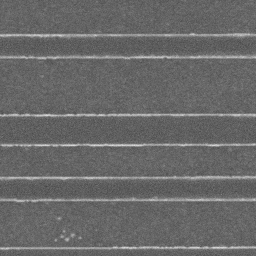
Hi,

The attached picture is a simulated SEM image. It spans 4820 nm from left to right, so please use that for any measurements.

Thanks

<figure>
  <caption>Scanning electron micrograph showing lines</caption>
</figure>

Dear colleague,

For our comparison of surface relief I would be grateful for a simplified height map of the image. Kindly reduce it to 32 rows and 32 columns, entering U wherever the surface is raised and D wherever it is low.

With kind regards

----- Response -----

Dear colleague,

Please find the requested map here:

DDDDDDDDDDDDDDDDDDDDDDDDDDDDDDDD
DDDDDDDDDDDDDDDDDDDDDDDDDDDDDDDD
DDDDDDDDDDDDDDDDDDDDDDDDDDDDDDDD
DDDDDDDDDDDDDDDDDDDDDDDDDDDDDDDD
UUUUUUUUUUUUUUUUUUUUUUUUUUUUUUUU
UUUUUUUUUUUUUUUUUUUUUUUUUUUUUUUU
UUUUUUUUUUUUUUUUUUUUUUUUUUUUUUUU
DDDDDDDDDDDDDDDDDDDDDDDDDDDDDDDD
DDDDDDDDDDDDDDDDDDDDDDDDDDDDDDDD
DDDDDDDDDDDDDDDDDDDDDDDDDDDDDDDD
DDDDDDDDDDDDDDDDDDDDDDDDDDDDDDDD
DDDDDDDDDDDDDDDDDDDDDDDDDDDDDDDD
DDDDDDDDDDDDDDDDDDDDDDDDDDDDDDDD
DDDDDDDDDDDDDDDDDDDDDDDDDDDDDDDD
UUUUUUUUUUUUUUUUUUUUUUUUUUUUUUUU
UUUUUUUUUUUUUUUUUUUUUUUUUUUUUUUU
UUUUUUUUUUUUUUUUUUUUUUUUUUUUUUUU
UUUUUUUUUUUUUUUUUUUUUUUUUUUUUUUU
DDDDDDDDDDDDDDDDDDDDDDDDDDDDDDDD
DDDDDDDDDDDDDDDDDDDDDDDDDDDDDDDD
DDDDDDDDDDDDDDDDDDDDDDDDDDDDDDDD
DDDDDDDDDDDDDDDDDDDDDDDDDDDDDDDD
UUUUUUUUUUUUUUUUUUUUUUUUUUUUUUUU
UUUUUUUUUUUUUUUUUUUUUUUUUUUUUUUU
UUUUUUUUUUUUUUUUUUUUUUUUUUUUUUUU
DDDDDDDDDDDDDDDDDDDDDDDDDDDDDDDD
DDDDDDDDDDDDDDDDDDDDDDDDDDDDDDDD
DDDDDDDDDDDDDDDDDDDDDDDDDDDDDDDD
DDDDDDDDDDDDDDDDDDDDDDDDDDDDDDDD
DDDDDDDDDDDDDDDDDDDDDDDDDDDDDDDD
DDDDDDDDDDDDDDDDDDDDDDDDDDDDDDDD
UUUUUUUUUUUUUUUUUUUUUUUUUUUUUUUU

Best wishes